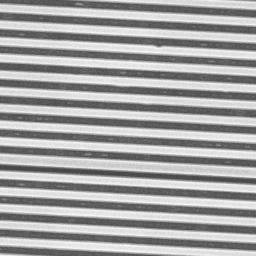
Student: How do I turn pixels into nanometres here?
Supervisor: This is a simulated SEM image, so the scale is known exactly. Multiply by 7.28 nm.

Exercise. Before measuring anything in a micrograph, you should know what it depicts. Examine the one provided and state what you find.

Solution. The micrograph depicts parallel lines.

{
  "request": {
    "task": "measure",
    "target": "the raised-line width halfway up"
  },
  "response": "56.3 nanometres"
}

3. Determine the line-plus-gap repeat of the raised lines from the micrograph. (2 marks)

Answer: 121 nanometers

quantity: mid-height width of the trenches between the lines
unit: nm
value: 62.7